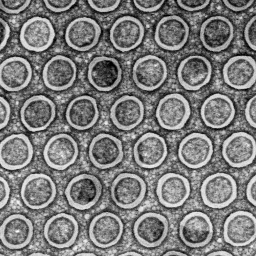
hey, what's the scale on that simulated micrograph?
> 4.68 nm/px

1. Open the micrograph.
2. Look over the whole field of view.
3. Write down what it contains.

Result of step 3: a regular array of raised bodies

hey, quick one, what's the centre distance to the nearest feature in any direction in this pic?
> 208 nm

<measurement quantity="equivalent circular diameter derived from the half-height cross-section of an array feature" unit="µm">0.147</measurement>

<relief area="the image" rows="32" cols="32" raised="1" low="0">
11100011100111100111000111001110
00000000000000000000000000000000
00001100001000011000111000110000
10011100011100111100111001111001
10011110111100111100111001111001
00011100011100111000111000110001
00000000000000000000000000000000
01100001100011000011000111000110
11110011100111100111100111001111
11110011100111100111101111001111
11100011100011000111000110000110
00000000000000000000000000000000
00001100011000011000111000110001
10011110011100111100111001111001
10011110111100111100111001111001
10011100011000011000111000110000
00000000000000000000000000000000
01100001100011000011000111000110
11110011110111100111100111001111
11110011100111100111100111001111
11100011100011000011000110000100
00000000000000000000000000000000
00011100011100011000111000111000
10011110011100111100111001111001
10011110011100111100111001111001
00011100011000011000010000110000
00000000000000000000000000000000
01100011100011100011000111001111
11110011100111100111100111001111
11110011100111100111000111001111
01100001000011000011000010000110
00000000000000000000000000000000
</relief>